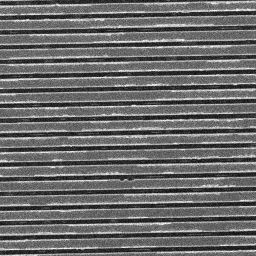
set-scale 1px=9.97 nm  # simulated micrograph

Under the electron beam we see parallel lines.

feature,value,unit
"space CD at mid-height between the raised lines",52.3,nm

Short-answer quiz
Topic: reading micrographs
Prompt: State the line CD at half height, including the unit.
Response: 97.2 nanometers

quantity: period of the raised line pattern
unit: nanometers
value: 146